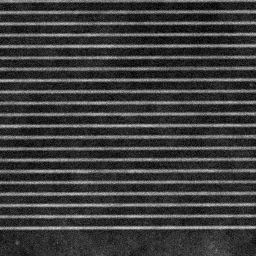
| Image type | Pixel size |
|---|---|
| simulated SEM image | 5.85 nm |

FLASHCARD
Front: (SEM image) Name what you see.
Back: parallel lines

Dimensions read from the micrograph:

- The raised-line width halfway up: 0.0161 microns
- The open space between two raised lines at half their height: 53.4 nanometers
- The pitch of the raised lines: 66.4 nm